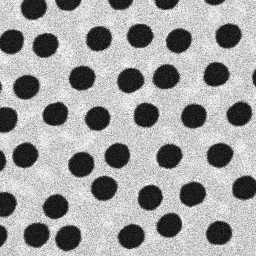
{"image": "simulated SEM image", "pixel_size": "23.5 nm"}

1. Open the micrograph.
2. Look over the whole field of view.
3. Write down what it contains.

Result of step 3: a regular array of holes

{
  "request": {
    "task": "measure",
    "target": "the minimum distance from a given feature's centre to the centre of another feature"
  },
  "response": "931 nanometres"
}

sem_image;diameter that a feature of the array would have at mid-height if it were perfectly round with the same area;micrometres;0.609